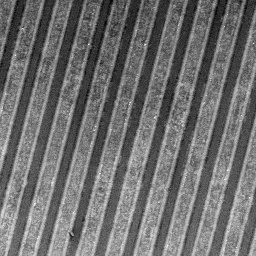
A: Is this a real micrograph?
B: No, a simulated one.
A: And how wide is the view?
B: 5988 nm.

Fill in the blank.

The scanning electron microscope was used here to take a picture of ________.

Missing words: parallel lines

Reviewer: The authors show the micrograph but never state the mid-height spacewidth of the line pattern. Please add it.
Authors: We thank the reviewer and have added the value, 0.311 µm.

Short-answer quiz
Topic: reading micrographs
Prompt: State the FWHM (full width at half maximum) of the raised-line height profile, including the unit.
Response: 0.334 microns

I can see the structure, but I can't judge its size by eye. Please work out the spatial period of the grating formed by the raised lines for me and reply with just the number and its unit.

651 nm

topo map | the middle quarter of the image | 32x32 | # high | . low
.####...####....###....###....##
.####...####...####...####....##
.###....####...####...####...###
####....###....###....####...###
####...####....###....###....###
####...####...####...####....###
###....###....####...####...####
###....###....###....####...####
###...####...####....###....####
###...####...####...####....###.
##....###....####...####...####.
##....###....###....####...####.
##...####...####....###....####.
##...####...####...####....###..
#....###....####...####...####..
#....###....###....###....####..
#...####...####....###....####..
#...####...####...####...####...
....###....####...####...####...
....###....###....###....####...
...####...####....###....####...
...####...####...####...####....
...###....####...####...####....
..####....###....###....####...#
..####...####....###....####...#
..####...####...####...####....#
..###....###....####...####....#
.####....###....###....####...##
.####...####...####....####...##
.####...####...####...####....##
.###....###....####...####...###
####....###....####...####...###